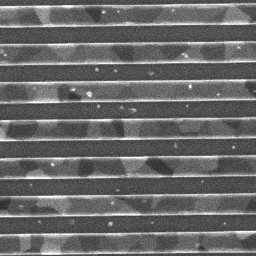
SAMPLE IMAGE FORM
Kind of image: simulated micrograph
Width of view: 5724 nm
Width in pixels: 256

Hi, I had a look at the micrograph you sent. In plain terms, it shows wiring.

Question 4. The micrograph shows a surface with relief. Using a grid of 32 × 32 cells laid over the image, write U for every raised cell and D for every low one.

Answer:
DDDDDDDDDDDDDDDDDDDDDDDDDDDDUUUU
UUUUUUUUUUUUUUUUUUUUUUUUUUUUUUUU
UUUUUUUUUUUUUUUUUUUUUUUUUUUUUUUU
DDDDDDDDDDDDDDDDDDDDDDDDDDDDDDDD
DDDDDDDDDDDDDDDDDDDDDDDDDDDDDDDD
DDDDDDDDUUUUUUUUUUUUUUUUUUUUUUUU
UUUUUUUUUUUUUUUUUUUUUUUUUUUUUUUU
UUUUUUUUUUUUUUUUUUUUUUUUUUUUUUUU
DDDDDDDDDDDDDDDDDDDDDDDDDDDDDDDD
DDDDDDDDDDDDDDDDDDDDDDDDDDDDDDDD
UUUUUUUUUUUUUUUUUUUUUUUUUUUUUUUU
UUUUUUUUUUUUUUUUUUUUUUUUUUUUUUUU
UUUUUUUUUUUUUUUUUUUUUUUUUDDDDDDD
DDDDDDDDDDDDDDDDDDDDDDDDDDDDDDDD
DDDDDDDDDDDDDDDDDDDDDDDDDDDDDDDD
UUUUUUUUUUUUUUUUUUUUUUUUUUUUUUUU
UUUUUUUUUUUUUUUUUUUUUUUUUUUUUUUU
UUUUUDDDDDDDDDDDDDDDDDDDDDDDDDDD
DDDDDDDDDDDDDDDDDDDDDDDDDDDDDDDD
DDDDDDDDDDDDDDDDDDDDDDDDDDDDDDDD
UUUUUUUUUUUUUUUUUUUUUUUUUUUUUUUU
UUUUUUUUUUUUUUUUUUUUUUUUUUUUUUUU
DDDDDDDDDDDDDDDDDDDDDDDDDDDDDDDD
DDDDDDDDDDDDDDDDDDDDDDDDDDDDDDDD
DDDDDDUUUUUUUUUUUUUUUUUUUUUUUUUU
UUUUUUUUUUUUUUUUUUUUUUUUUUUUUUUU
UUUUUUUUUUUUUUUUUUUUUUUUUUUUUUUU
DDDDDDDDDDDDDDDDDDDDDDDDDDDDDDDD
DDDDDDDDDDDDDDDDDDDDDDDDDDDDDDDD
UUUUUUUUUUUUUUUUUUUUUUUUUUUUUUUU
UUUUUUUUUUUUUUUUUUUUUUUUUUUUUUUU
UUUUUUUUUUUUUUUUUUUUUUDDDDDDDDDD